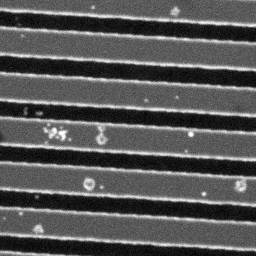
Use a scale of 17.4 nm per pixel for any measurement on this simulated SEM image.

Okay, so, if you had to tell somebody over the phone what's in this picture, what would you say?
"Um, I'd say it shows lines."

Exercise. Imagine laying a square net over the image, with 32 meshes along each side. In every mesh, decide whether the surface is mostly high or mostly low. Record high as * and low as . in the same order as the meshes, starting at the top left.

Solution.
********************************
....****************************
...................*************
*...............................
*****************...............
********************************
********************************
.........***********************
..........................******
*******.........................
***********************.........
********************************
********************************
...............*****************
...............................*
**************..................
*******************************.
********************************
.......*************************
......................**********
****............................
********************............
********************************
********************************
.............*******************
.............................***
**********......................
**************************......
********************************
..******************************
...................*************
**..............................